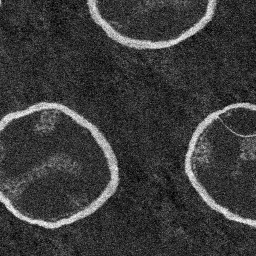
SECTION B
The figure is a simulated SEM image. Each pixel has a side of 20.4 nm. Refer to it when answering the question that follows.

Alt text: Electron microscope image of raised bodies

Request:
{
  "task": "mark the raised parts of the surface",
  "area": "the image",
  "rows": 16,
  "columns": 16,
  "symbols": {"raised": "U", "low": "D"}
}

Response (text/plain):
DDDDDDUUUUUUUDDD
DDDDDDUUUUUUUDDD
DDDDDDDDUUUDDDDD
DDDDDDDDDDDDDDDD
DDDDDDDDDDDDDDDD
DDDDDDDDDDDDDDDD
DDDDDDDDDDDDDDDD
UUUUUDDDDDDDDUUU
UUUUUUDDDDDDUUUU
UUUUUUUDDDDDUUUU
UUUUUUUDDDDDUUUU
UUUUUUUDDDDDUUUU
UUUUUUDDDDDDDUUU
DUUUUDDDDDDDDDUU
DDDDDDDDDDDDDDDD
DDDDDDDDDDDDDDDD